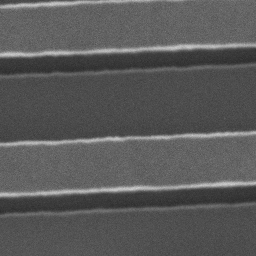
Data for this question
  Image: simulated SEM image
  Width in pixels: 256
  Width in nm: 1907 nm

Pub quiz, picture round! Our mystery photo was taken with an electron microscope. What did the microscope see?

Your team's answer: lines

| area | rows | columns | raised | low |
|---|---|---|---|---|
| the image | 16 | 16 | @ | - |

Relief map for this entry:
@@@@@@@@@@@@@@@@
@@@@@@@@@@@@@@@@
@@@@@@@@@@@@@@@@
----------------
----------------
----------------
----------------
----------------
----------@@@@@@
@@@@@@@@@@@@@@@@
@@@@@@@@@@@@@@@@
@@@@@@@@@@@@@@@@
----------------
----------------
----------------
----------------